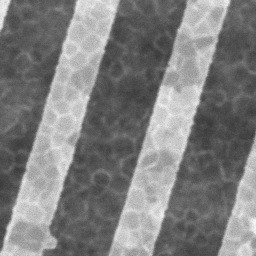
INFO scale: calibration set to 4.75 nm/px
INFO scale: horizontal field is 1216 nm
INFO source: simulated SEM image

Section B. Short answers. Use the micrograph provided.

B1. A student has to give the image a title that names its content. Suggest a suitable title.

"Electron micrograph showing one or a few lines or trenches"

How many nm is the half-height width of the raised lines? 182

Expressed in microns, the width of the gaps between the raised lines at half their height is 0.314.